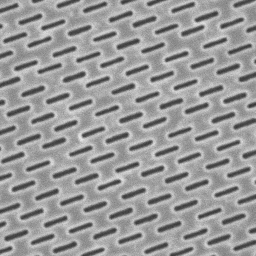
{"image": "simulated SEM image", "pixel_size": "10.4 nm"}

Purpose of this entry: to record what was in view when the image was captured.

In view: a regular array of holes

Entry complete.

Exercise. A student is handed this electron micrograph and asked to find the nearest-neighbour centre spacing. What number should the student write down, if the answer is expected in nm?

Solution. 250